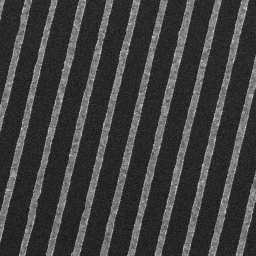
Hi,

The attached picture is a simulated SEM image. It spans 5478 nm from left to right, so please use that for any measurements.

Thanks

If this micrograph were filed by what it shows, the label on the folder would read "parallel lines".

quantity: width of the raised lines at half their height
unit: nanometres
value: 133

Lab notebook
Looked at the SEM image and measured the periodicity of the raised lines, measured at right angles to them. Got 566 nanometres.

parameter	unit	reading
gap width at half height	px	19.9